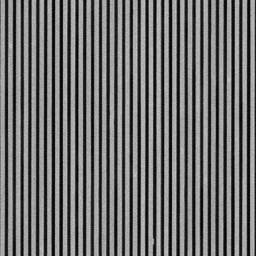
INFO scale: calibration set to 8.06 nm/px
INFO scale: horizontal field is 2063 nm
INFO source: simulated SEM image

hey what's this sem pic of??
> parallel lines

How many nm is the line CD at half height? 34.3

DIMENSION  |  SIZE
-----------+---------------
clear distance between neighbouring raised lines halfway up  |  27.2 nm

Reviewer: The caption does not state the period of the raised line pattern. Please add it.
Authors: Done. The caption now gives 62.9 nm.